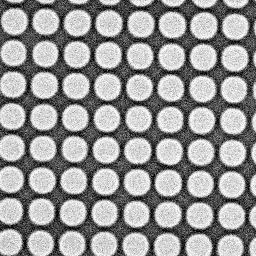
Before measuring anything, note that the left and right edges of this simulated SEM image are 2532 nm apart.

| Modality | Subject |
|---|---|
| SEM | an array of small figures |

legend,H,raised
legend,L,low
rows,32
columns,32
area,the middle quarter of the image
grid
LLHHLLLLLLHHHLLLLHHHHLLLLHHHHLLL
LLLLLLLLLLLLLLLLLLLLLLLLLLLLLLLL
LLLLLLLLLLLLLLLLLLLLLLLLLLLLLLLL
LHHHHLLLLHHHHLLLLHHHHLLLLHHHLLLL
HHHHHHLLHHHHHHLLHHHHHHLLHHHHHLLL
HHHHHHLLHHHHHHLLHHHHHHLLHHHHHHLL
HHHHHHLLHHHHHHLLHHHHHHLLHHHHHHLL
LHHHHHLLHHHHHHLLHHHHHHLLHHHHHHLL
LLHHLLLLLLHHHLLLLHHHLLLLLHHHHLLL
LLLLLLLLLLLLLLLLLLLLLLLLLLLLLLLL
LLHHLLLLLLLLLLLLLLLLLLLLLLLLLLLL
HHHHHLLLLHHHHLLLLHHHHLLLLHHHLLLL
HHHHHHLLHHHHHHLLHHHHHLLLHHHHHLLL
HHHHHHLLHHHHHHLLHHHHHHLLHHHHHHLH
HHHHHHLLHHHHHHLLHHHHHHLLHHHHHHLH
HHHHHLLLHHHHHLLLHHHHHLLLHHHHHLLL
LLHLLLLLLLHHLLLLLHHHLLLLLHHHLLLL
LLLLLLLLLLLLLLLLLLLLLLLLLLLLLLLL
LHHHLLLLLLHLLLLLLLLLLLLLLLLLLLLL
HHHHHLLLHHHHHLLLHHHHHLLLHHHHLLLL
HHHHHHLLHHHHHLLLHHHHHLLHHHHHHLLL
HHHHHHLHHHHHHHLHHHHHHHLHHHHHHLLH
HHHHHHLLHHHHHHLHHHHHHHLHHHHHHLLH
LHHHHLLLHHHHHLLLHHHHHLLLHHHHHLLH
LLLLLLLLLLHHLLLLLHHHLLLLLHHHLLLL
LLLLLLLLLLLLLLLLLLLLLLLLLLLLLLLL
LHHHLLLLLHHLLLLLLLLLLLLLLLLLLLLL
HHHHHLLLHHHHHLLLHHHHHLLLHHHHLLLL
HHHHHLLHHHHHHLLHHHHHHLLHHHHHHLLH
HHHHHLLHHHHHHLLHHHHHHLLHHHHHHLLH
HHHHHLLHHHHHHLLHHHHHHLLHHHHHHLLH
HHHHHLLLHHHHHLLLHHHHHLLHHHHHHLLH